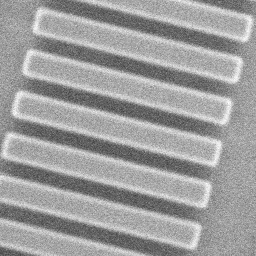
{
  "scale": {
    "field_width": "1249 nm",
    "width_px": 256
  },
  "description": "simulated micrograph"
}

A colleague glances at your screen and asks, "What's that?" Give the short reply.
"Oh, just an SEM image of groups of lines, slits or small figures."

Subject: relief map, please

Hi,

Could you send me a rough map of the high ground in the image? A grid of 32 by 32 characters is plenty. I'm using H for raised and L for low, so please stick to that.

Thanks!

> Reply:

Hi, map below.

LLLLLLLLLLLLHHHHHHHHHHHHHLLLLLLL
LLLLLHHLLLLLLLLLHHHHHHHHHHHHHLLL
LLLLHHHHHHHLLLLLLLLLHHHHHHHHHHHL
LLLLHHHHHHHHHHHLLLLLLLLLHHHHHHHL
LLLLLLHHHHHHHHHHHHHLLLLLLLLLHHHL
LLLLLLLLLLHHHHHHHHHHHHHLLLLLLLLL
LLLLHLLLLLLLLLHHHHHHHHHHHHHLLLLL
LLLHHHHHHLLLLLLLLLHHHHHHHHHHHHLL
LLLHHHHHHHHHHLLLLLLLLLHHHHHHHHLL
LLLLHHHHHHHHHHHHHLLLLLLLLLHHHHLL
LLLLLLLLHHHHHHHHHHHHHLLLLLLLLLLL
LLLLLLLLLLLLHHHHHHHHHHHHHLLLLLLL
LLHHHHHLLLLLLLLLHHHHHHHHHHHHLLLL
LLHHHHHHHHHLLLLLLLLLHHHHHHHHHLLL
LLHHHHHHHHHHHHHLLLLLLLLLHHHHLLLL
LLLLLLHHHHHHHHHHHHHLLLLLLLLLLLLL
LLLLLLLLLLHHHHHHHHHHHHHLLLLLLLLL
LHHHHLLLLLLLLLHHHHHHHHHHHHHLLLLL
HHHHHHHHLLLLLLLLLLHHHHHHHHHHLLLL
HHHHHHHHHHHHHLLLLLLLLLHHHHHLLLLL
LLLLHHHHHHHHHHHHHLLLLLLLLLHLLLLL
LLLLLLLLHHHHHHHHHHHHHLLLLLLLLLLL
HHHLLLLLLLLLHHHHHHHHHHHHHLLLLLLL
HHHHHHHLLLLLLLLLHHHHHHHHHHLLLLLL
HHHHHHHHHHHLLLLLLLLLHHHHHHLLLLLL
LHHHHHHHHHHHHHHLLLLLLLLLHHLLLLLL
LLLLLLHHHHHHHHHHHHHLLLLLLLLLLLLL
LLLLLLLLLHHHHHHHHHHHHHHLLLLLLLLL
HHHHHLLLLLLLLLHHHHHHHHHHHLLLLLLL
HHHHHHHHLLLLLLLLLHHHHHHHHLLLLLLL
HHHHHHHHHHHHHLLLLLLLLLHHLLLLLLLL
LLLHHHHHHHHHHHHHLLLLLLLLLLLLLLLL